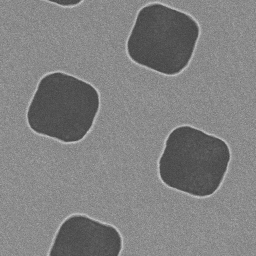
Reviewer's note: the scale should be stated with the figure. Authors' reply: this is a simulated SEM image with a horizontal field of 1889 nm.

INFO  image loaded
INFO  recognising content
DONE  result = holes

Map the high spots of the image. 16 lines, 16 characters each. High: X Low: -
XXXXXXXXX--XXXXX
XXXXXXXX----XXXX
XXXXXXXX----XXXX
XXXXXXXX----XXXX
XXXXXXXXXX-XXXXX
XX----XXXXXXXXXX
XX----XXXXXXXXXX
XX----XXXXXXXXXX
XXX--XXXXXX--XXX
XXXXXXXXXX----XX
XXXXXXXXXX----XX
XXXXXXXXXX----XX
XXXXXXXXXXXXXXXX
XXXXXXXXXXXXXXXX
XXXX---XXXXXXXXX
XXX-----XXXXXXXX